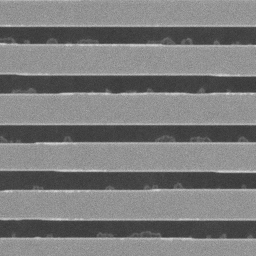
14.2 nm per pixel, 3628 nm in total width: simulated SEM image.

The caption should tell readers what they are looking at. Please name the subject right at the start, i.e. lines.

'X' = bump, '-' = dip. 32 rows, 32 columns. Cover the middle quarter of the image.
XXXXXXXXXXXXXXXXXXXXXXXXXXXXXXXX
XXXXXXXXXXXXXXXXXXXXXXXXXXXXXXXX
XXXXXXXXXXXXXXXXXXXXXXXXXXXXXXXX
--------------------------------
--------------------------------
--------------------------------
--------------------------------
XXXXXXXXXXXX--XXXXXXXXXXXXXXXXX-
XXXXXXXXXXXXXXXXXXXXXXXXXXXXXXXX
XXXXXXXXXXXXXXXXXXXXXXXXXXXXXXXX
XXXXXXXXXXXXXXXXXXXXXXXXXXXXXXXX
XXXXXXXXXXXXXXXXXXXXXXXXXXXXXXXX
XXXXXXXXXXXXXXXXXXXXXXXXXXXXXXXX
XXXXXXXXXXXXXXXXXXXXXXXXXXXXXXXX
XXXXXXXXXXXXXXXXXXXXXXXXXXXXXXXX
--------------------------------
--------------------------------
--------------------------------
--------------------------------
--------------------------------
XXXXXXXXXXXXXXXXXXXXXXXXXXXXXXXX
XXXXXXXXXXXXXXXXXXXXXXXXXXXXXXXX
XXXXXXXXXXXXXXXXXXXXXXXXXXXXXXXX
XXXXXXXXXXXXXXXXXXXXXXXXXXXXXXXX
XXXXXXXXXXXXXXXXXXXXXXXXXXXXXXXX
XXXXXXXXXXXXXXXXXXXXXXXXXXXXXXXX
XXXXXXXXXXXXXXXXXXXXXXXXXXXXXXXX
--------------------------------
--------------------------------
--------------------------------
--------------------------------
---------------------XXXXXXXXXXX